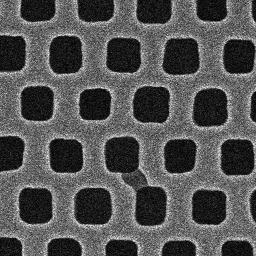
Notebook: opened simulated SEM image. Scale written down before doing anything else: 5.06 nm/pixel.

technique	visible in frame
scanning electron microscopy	a regular array of holes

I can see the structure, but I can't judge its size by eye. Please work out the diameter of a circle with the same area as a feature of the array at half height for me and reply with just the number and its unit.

189 nm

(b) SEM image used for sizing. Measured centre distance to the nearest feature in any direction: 286 nm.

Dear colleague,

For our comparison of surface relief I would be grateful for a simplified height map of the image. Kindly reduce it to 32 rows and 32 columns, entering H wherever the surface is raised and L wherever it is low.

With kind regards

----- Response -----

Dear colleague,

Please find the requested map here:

HHHLLLLHHHLLLLHHHLLLLHHHLLLLHHHL
HHHLLLLHHHLLLLHHHLLLLLHHHLLLHHHL
HHHLLLHHHHLLLLHHHLLLLHHHHLLLHHHH
HHHHHHHHHHHHHHHHHHHHHHHHHHHHHHHH
LLHHHHHHLHHHHHHHHHHHHHHHHHHHHHHH
LLLHHHLLLLHHHHLLLLHHHLLLLHHHLLLL
LLLHHHLLLLHHHLLLLLHHHLLLLHHHLLLL
LLLHHHLLLLHHHLLLLLHHLLLLLHHHLLLL
LLLHHHLLLLHHHHLLLHHHLLLLLHHHLLLL
HHHHHHHHHHHHHHHHHHHHHHHHHHHHHHHH
HHHHHHHHHHHHHHHHHHHHHHHHHHHHHHHH
HHHLLLLHHHLLLLHHHLLLLHHHHLLLHHHH
HHHLLLLHHHLLLLHHHLLLLHHHLLLLHHHL
HHHLLLLHHHLLLLHHHLLLLHHHLLLLHHHL
HHHLLLHHHHLLLLHHHLLLLHHHLLLLHHHL
HHHHHHHHHHHHHHHHHHHHHHHHHLLLHHHH
HHHHHHHHHHHHHHHHHHHHHHHHHHHHHHHH
LLLHHHHLLHHHHHLLLHHHHHLLHHHHLLLH
LLLHHHLLLLHHHLLLLHHHHLLLLHHHLLLL
LLLHHHLLLLHHHLLLLHHHLLLLHHHHLLLL
LLLHHHLLLLHHHLLLLHHHHLLLHHHHLLLL
HHHHHHHLLLHHHHLLLHHHHLLHHHHHLLLH
HHHHHHHHHHHHHHHHHHHHHHHHHHHHHHHH
HHHHHHHHHHHLHHHHHHLLHHHHHHHHHHHH
HHLLLLHHHLLLLLHHHLLLLHHHLLLLHHHL
HHLLLLLHHLLLLLHHHLLLLHHHLLLLHHHL
HHLLLLLHHLLLLLHHHLLLLHHHLLLLHHHL
HHHLLLHHHHLLLLHHHLLLLHHHLLLLHHHH
HHHHHHHHHHHHHHHHHHHHHHHHHHHHHHHH
HHHHHHHHHHHHHHHHHHHHHHHHHHHHHHHH
LLLHHHLLLLHHHLLLLHHHHLLLHHHHLLLH
LLLHHHLLLLHHHLLLLHHHLLLLHHHHLLLL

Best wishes